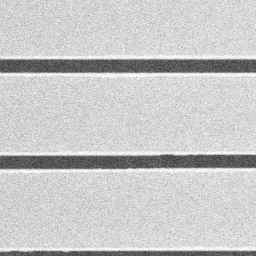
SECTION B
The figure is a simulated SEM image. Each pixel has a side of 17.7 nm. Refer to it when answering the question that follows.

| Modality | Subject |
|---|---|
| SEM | lines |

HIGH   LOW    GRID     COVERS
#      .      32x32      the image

################################
################################
################################
################################
################################
################################
################################
................................
................................
################################
################################
################################
################################
################################
################################
################################
################################
################################
################################
................................
................................
################################
################################
################################
################################
################################
################################
################################
################################
################################
################################
................................